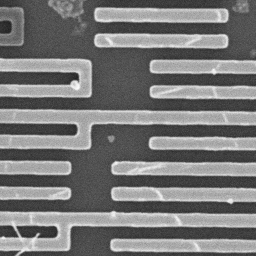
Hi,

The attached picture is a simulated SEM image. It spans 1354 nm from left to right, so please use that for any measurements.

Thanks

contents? wiring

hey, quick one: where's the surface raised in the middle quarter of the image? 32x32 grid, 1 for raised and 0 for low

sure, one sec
11111110000000000000001111111111
11111110000000000000001111111111
00001110000000000000000000000000
00001110000000000000000000000000
00101110000000000000000000000000
01111110000000000000000000000000
11111110000000000000001111111111
11111110000000000000001111111111
00000000000000000000000000000000
00000000000000000000000000000000
00000000000000000000000000000000
00000000000000000000000000000000
11111111111111111111111111111111
11111111111111111111111111111111
11111111111111111111111111111111
00011110000000000000000000000000
00001100000000000000000000000000
00011100000000000000000000000000
11111100000000000000001111100000
11111100000000000000001111111111
11111100000000000000001111111111
00000000000000000000000000000000
00000000000000000000000000000000
00000000000000000000000000000000
10000000000001111000000000000000
11000000000011111111111111111111
11000000000011111111111111111111
00000000000000011110001111111111
00000000000000000000000000000000
00000000000000000000000000000000
00000000000000000000000000000000
11000000000011111111111111111111